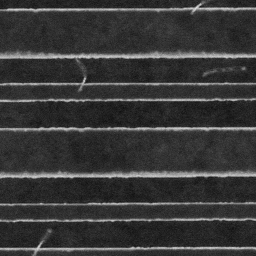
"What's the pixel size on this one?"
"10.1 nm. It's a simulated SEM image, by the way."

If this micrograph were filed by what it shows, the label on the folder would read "lines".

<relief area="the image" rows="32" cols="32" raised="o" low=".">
................................
oooooooooooooooooooooooooooooooo
oooooooooooooooooooooooooooooooo
oooooooooooooooooooooooooooooooo
oooooooooooooooooooooooooooooooo
oooooooooooooooooooooooooooooooo
oooooooooooooooooooooooooooooooo
................................
................................
................................
oooooooooooooooooooooooooooooooo
oooooooooooooooooooooooooooooooo
oooooooooooooooooooooooooooooo..
................................
................................
................................
oooooooooooooooooooooooooooooooo
oooooooooooooooooooooooooooooooo
oooooooooooooooooooooooooooooooo
oooooooooooooooooooooooooooooooo
oooooooooooooooooooooooooooooooo
oooooooooooooooooooooooooooooooo
................................
................................
................................
.....o.....ooooooooooooooooooooo
oooooooooooooooooooooooooooooooo
oooooooooooooooo................
................................
................................
................................
oooooooooooooooooooooooooooooooo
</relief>